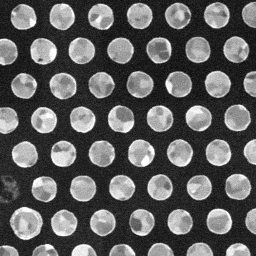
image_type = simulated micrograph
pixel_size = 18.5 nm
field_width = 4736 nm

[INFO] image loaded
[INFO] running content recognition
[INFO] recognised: a regular array of raised bodies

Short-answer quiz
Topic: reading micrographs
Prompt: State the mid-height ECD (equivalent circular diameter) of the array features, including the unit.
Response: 461 nm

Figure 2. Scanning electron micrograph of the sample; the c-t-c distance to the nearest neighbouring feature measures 712 nanometres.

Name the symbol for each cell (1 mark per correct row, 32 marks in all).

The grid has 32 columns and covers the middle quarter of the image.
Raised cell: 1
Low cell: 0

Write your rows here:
00000000000000000000000000000000
00000000000000000000000000000000
10000000111000000111000000011100
11000001111100001111110000111110
11100011111100001111110000111111
11100011111100001111110000111111
11100001111100001111110000111111
11000001111000000111100000011110
10000000000000000000000000000000
00000000000000000000000000000000
00000000000000000000000000000000
00111100000011110000001111000001
00111110000111111000011111100001
00111111000111111000011111100001
00111111000111111000011111100001
00111110000011111000001111100001
00011100000011110000000110000000
00000000000000000000000000000000
00000000000000000000000000000000
10000000011000000011100000011100
11000001111100000111110000111110
11100001111100001111110000111111
11100011111100001111110000111111
11100001111100001111110000111111
11000001111100000111110000011110
00000000011000000001000000000000
00000000000000000000000000000000
00000000000000000000000000000000
00011100000011110000001111000000
00111110000011111000011111100001
00111111000011111100011111100001
00111111000011111100011111100001